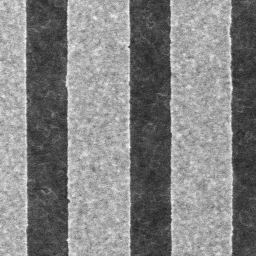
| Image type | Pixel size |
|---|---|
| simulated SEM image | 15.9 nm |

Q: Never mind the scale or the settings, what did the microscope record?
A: one or a few lines or trenches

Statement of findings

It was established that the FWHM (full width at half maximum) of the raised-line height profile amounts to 967 nanometers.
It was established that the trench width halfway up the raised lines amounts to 666 nm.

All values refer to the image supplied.